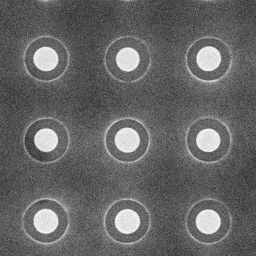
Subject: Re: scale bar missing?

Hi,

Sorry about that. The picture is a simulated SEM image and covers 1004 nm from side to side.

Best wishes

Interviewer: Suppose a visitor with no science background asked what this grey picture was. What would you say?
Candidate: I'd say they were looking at an array of small figures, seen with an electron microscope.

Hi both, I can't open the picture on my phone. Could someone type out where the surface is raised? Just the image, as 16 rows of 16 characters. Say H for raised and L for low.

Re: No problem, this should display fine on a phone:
HHHHHHHHHHHHHHHH
HHHHHHHHHHHHHHHH
HHLLHHHLLHHHHLHH
HHLLHHHLLHHHLLHH
HHLLHHHLLHHHLLHH
HHHHHHHHHHHHHHHH
HHHHHHHHHHHHHHHH
HHHHHHHHHHHHLLHH
HHLLHHHLLHHHLLHH
HHLLHHHLLHHHLLHH
HHHHHHHHHHHHHHHH
HHHHHHHHHHHHHHHH
HHHHHHHHHHHHHHHH
HHLLHHHLLHHHLLHH
HHLLHHHLLHHHLLHH
HHHHHHHHHHHHHHHH